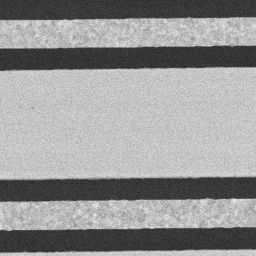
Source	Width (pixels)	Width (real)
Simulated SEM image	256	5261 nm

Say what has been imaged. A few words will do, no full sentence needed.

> lines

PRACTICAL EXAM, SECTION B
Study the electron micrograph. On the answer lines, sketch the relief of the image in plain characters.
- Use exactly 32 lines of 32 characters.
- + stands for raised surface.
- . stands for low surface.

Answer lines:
................................
................................
........++++++++++++++++++++++++
++++++++++++++++++++++++++++++++
++++++++++++++++++++++++++++++++
++++++++++++++++++++++++++++++++
................................
................................
.......................+.+++++++
++++++++++++++++++++++++++++++++
++++++++++++++++++++++++++++++++
++++++++++++++++++++++++++++++++
++++++++++++++++++++++++++++++++
++++++++++++++++++++++++++++++++
++++++++++++++++++++++++++++++++
++++++++++++++++++++++++++++++++
++++++++++++++++++++++++++++++++
++++++++++++++++++++++++++++++++
++++++++++++++++++++++++++++++++
++++++++++++++++++++++++++++++++
++++++++++++++++++++++++++++++++
++++++++++++++++++++++++++++++++
................................
................................
................................
++++++++++++++++++++++++++++++++
++++++++++++++++++++++++++++++++
++++++++++++++++++++++++++++++++
++++++++++++++++++++............
................................
................................
...............+++++++++++++++++